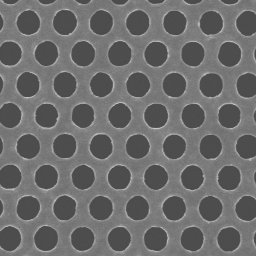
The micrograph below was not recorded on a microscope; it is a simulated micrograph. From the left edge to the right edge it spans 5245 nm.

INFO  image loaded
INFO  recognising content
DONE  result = a regular array of holes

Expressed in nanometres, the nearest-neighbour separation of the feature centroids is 729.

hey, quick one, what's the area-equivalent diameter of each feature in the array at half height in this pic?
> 489 nm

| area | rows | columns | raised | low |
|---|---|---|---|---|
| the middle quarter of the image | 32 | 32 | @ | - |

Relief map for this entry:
@@@@--@@@@@@@-@@@@@@@@--@@@@@@@@
@@@@@@@@@@@@@@@@@@@@@@@@@@@@@@@@
--@@@@@@---@@@@@@---@@@@@@---@@@
---@@@@-----@@@@-----@@@@-----@@
---@@@@-----@@@@-----@@@@-----@@
---@@@@-----@@@-------@@@-----@@
---@@@@-----@@@@-----@@@@-----@@
--@@@@@@---@@@@@@---@@@@@-----@@
@@@@@@@@@@@@@@@@@@@@@@@@@@@@@@@@
@@@@@@@@@@@@@@@@@@@@@@@@@@@@@@@@
@@@---@@@@@@----@@@@@----@@@@@--
@@-----@@@@@----@@@@------@@@@--
@@------@@@------@@@------@@@@--
@@------@@@------@@@------@@@---
@@-----@@@@-----@@@@------@@@@--
@@@---@@@@@@---@@@@@@----@@@@@--
@@@@@@@@@@@@@@@@@@@@@@@@@@@@@@@@
-@@@@@@@@-@@@@@@@@@@@@@@@@@@@@@@
---@@@@-----@@@@-----@@@@-----@@
---@@@@-----@@@@-----@@@@-----@@
---@@@------@@@------@@@@-----@@
---@@@@-----@@@------@@@@-----@@
--@@@@@-----@@@@-----@@@@-----@@
-@@@@@@@@-@@@@@@@@-@@@@@@@---@@@
@@@@@@@@@@@@@@@@@@@@@@@@@@@@@@@@
@@@@--@@@@@@@--@@@@@@@--@@@@@@@-
@@-----@@@@@----@@@@@----@@@@@--
@@------@@@------@@@------@@@---
@@------@@@------@@@------@@@---
@@-----@@@@-----@@@@------@@@---
@@@----@@@@@----@@@@@----@@@@@--
@@@@-@@@@@@@@@@@@@@@@@@@@@@@@@@@